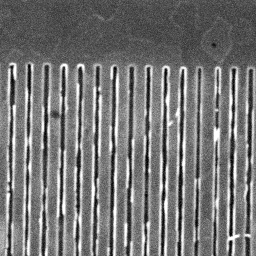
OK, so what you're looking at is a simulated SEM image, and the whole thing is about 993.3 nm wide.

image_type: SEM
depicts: parallel lines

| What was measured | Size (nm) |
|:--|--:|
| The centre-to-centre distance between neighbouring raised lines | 65.8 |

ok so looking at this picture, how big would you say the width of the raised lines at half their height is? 0.0513 micrometres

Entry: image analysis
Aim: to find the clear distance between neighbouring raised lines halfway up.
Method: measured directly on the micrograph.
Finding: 0.0136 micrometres